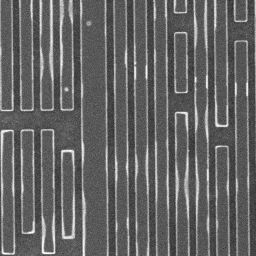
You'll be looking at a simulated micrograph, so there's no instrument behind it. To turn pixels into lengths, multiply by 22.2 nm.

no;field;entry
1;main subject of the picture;groups of lines, slits or small figures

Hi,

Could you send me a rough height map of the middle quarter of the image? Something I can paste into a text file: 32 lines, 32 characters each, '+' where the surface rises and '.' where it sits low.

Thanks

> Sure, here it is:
++..+++++++..+++..+++..+++..+++.
++..+++++++..+++..+++..+++..+++.
++..+++++++..+++..+++..+++..+++.
++..+++++++..+++..+++..+++..+++.
++..+++++++..+++..+++..+++..+++.
++...++++++..+++..+++..+++..+++.
++...++++++..+++..+++..+++..+++.
++...++++++..+++..+++..+++......
++...++++++..+++..+++..+++......
++...++++++..+++..+++..+++......
++...++++++..+++..+++..+++......
.....++++++..+++..+++..+++......
.....++++++..+++..+++..+++..++..
.....++++++..+++..+++..+++..+++.
.....++++++..+++..+++..+++..+++.
.....++++++..+++..+++..+++..+++.
.....++++++..+++..+++..+++..+++.
.....++++++..+++..+++..+++..+++.
.....++++++..+++..+++..+++..+++.
.....++++++..+++..+++..+++..+++.
.....++++++..+++..+++..+++..+++.
.....++++++..+++..+++..+++..+++.
++...++++++..+++..+++..+++..+++.
++...++++++..+++..+++..+++..+++.
++...++++++..+++..+++..+++..+++.
++...++++++..+++..+++..+++..+++.
++...++++++..+++..+++..+++..+++.
++...++++++..+++..+++..+++..+++.
++...++++++..+++..+++..+++..+++.
++...++++++..+++..+++..+++..++..
++...++++++..+++..+++..+++..++..
++...++++++..+++..+++..+++..++..